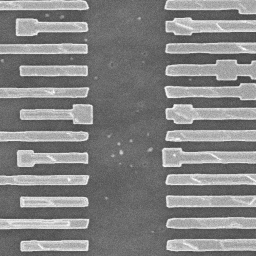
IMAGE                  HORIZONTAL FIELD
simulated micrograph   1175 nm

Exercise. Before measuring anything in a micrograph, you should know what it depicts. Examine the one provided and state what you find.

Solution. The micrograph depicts wiring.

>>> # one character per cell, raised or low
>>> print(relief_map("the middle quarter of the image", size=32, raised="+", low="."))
...........................+++++
++++++....................++++++
++++++....................++++++
................................
................................
................................
++++++...................+++++++
++++++....................++++++
................................
................................
..+++++....................+++++
.++++++...................++++++
+++++++...................++++++
+++++++...................++++++
..+++++.....................++++
................................
................................
++++++....................++++++
++++++....................++++++
................................
................................
.........................++++...
++++++...................+++++++
++++++...................+++++++
++++++...................+++++++
.........................+..+...
................................
................................
++++++....................++++++
++++++....................++++++
................................
................................